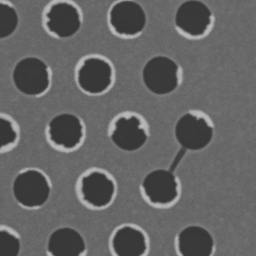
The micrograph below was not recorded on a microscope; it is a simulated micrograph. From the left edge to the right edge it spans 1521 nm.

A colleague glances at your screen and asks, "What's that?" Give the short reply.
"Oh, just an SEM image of a regular array of holes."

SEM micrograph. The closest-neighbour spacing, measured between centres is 372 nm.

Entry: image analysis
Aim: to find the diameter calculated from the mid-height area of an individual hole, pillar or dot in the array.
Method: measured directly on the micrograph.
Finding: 200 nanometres